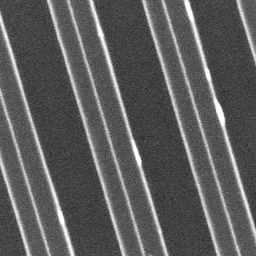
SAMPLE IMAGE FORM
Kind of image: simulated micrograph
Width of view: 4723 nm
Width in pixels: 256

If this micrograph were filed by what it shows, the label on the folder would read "lines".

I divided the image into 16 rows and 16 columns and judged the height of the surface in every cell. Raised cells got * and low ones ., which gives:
...***...***...*
...***...***...*
....**....**....
*...***...***...
*...***...***...
*....**....**...
**...***...***..
**...***...***..
**...***...***..
***...***...**..
***...***...***.
***...***...***.
.**....**....**.
.***...***...***
.***...***...***
..**....**...***